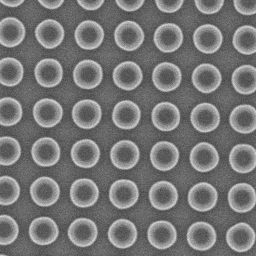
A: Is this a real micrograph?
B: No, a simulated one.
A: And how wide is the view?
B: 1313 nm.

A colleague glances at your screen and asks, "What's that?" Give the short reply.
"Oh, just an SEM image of an array of small figures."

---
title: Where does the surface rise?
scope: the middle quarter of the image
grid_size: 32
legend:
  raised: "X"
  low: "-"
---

---XXXXXX----XXXXX-----XXXXX----
---XXXXXX----XXXXXX----XXXXXX---
--XXXXXXX---XXXXXXX---XXXXXXX---
---XXXXXX---XXXXXXX---XXXXXXX---
---XXXXXX----XXXXXX---XXXXXXX---
----XXXX------XXXX-----XXXXX----
------------------------XXX-----
--------------------------------
--------------------------------
----XXXX------XXX---------------
---XXXXXX----XXXXX-----XXXXX----
--XXXXXXX---XXXXXXX---XXXXXX----
--XXXXXXX---XXXXXXX---XXXXXXX---
--XXXXXXX---XXXXXXX---XXXXXXX---
---XXXXXX----XXXXXX---XXXXXXX---
----XXXX-----XXXXX-----XXXXX----
------------------------XXX-----
--------------------------------
--------------------------------
---XXXX-------XXX---------------
--XXXXXX-----XXXXX-----XXXXX----
--XXXXXXX---XXXXXXX---XXXXXX----
--XXXXXXX---XXXXXXX---XXXXXXX---
--XXXXXXX---XXXXXXX---XXXXXXX---
---XXXXX----XXXXXX----XXXXXX----
----XXX------XXXX------XXXXX----
------------------------XX------
--------------------------------
--------------------------------
---XXXX------XXXX-------XX------
--XXXXXX----XXXXXX----XXXXX-----
--XXXXXX----XXXXXX----XXXXXX----